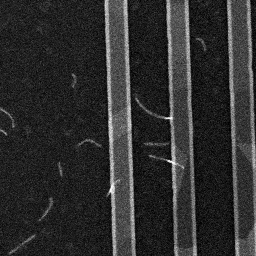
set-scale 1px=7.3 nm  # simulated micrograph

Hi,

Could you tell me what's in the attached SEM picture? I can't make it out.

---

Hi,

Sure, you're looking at one or a few lines or trenches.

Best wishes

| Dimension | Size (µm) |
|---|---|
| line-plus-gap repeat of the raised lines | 0.448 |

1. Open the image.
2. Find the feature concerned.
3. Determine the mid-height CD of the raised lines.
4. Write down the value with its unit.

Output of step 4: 141 nm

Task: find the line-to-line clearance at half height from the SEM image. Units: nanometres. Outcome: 310